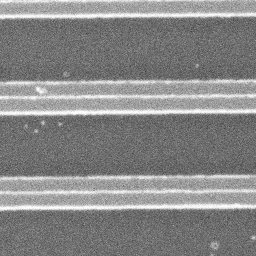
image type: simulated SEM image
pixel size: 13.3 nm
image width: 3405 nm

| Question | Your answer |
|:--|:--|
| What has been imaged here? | lines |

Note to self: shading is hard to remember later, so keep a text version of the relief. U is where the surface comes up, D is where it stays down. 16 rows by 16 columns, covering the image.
UUUUUUUUUUUUUUUU
DDDDDDDDDDDDDDDD
DDDDDDDDDDDDDDDD
DDDDDDDDDDDDDDDD
DDDDDDDDDDDDDDDD
UUUUUUUUUUUUUUUU
UUUUUUUUUUUUUUUU
DDDDDDDDDDDDDDDD
DDDDDDDDDDDDDDDD
DDDDDDDDDDDDDDDD
DDDDDDDDDDDDDDDD
UUUUUUUUUUUUUUUU
UUUUUUUUUUUUUUUU
DDDDDDDDDDDDDDDD
DDDDDDDDDDDDDDDD
DDDDDDDDDDDDDDDD